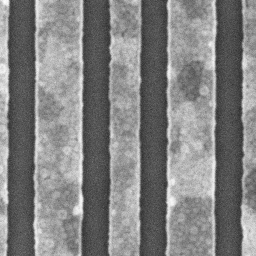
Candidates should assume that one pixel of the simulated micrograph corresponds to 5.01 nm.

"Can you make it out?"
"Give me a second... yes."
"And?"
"lines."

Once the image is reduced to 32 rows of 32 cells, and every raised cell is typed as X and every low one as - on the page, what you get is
X----XXXXX----XXXX---XXXXXX---XX
X----XXXXX----XXXX---XXXXXX---XX
X----XXXXX----XXXX---XXXXXX---XX
X----XXXXX----XXXX---XXXXXX---XX
X---XXXXXX----XXXX---XXXXXX----X
X----XXXXX----XXXX---XXXXXX---XX
X----XXXXX----XXXX---XXXXXX---XX
X----XXXXX----XXX----XXXXXX---XX
X----XXXXX----XXX----XXXXXX---XX
X----XXXXX----XXX----XXXXXX---XX
X----XXXXX----XXXX---XXXXXX---XX
X---XXXXXX----XXX----XXXXXX---XX
X----XXXXX----XXX----XXXXXX---XX
X----XXXXX----XXX----XXXXXX---XX
X----XXXXX----XXX----XXXXXX---XX
X----XXXXX----XXX----XXXXXX---XX
X---XXXXXX----XXX----XXXXXX---XX
X----XXXXX----XXX----XXXXXX---XX
X---XXXXXX----XXX----XXXXXX---XX
X---XXXXXX----XXX----XXXXXX----X
X---XXXXXX----XXX----XXXXXX---XX
X---XXXXXX----XXX----XXXXXX---XX
X---XXXXXX----XXX----XXXXXX---XX
X---XXXXXX----XXX----XXXXXX---XX
X---XXXXXX----XXX----XXXXXX---XX
X---XXXXXX----XXX----XXXXXX---XX
X---XXXXXX----XXX----XXXXXX---XX
X---XXXXXX----XXX----XXXXXX---XX
X---XXXXXX----XXX----XXXXXX---XX
X---XXXXXX----XXX----XXXXXX---XX
X---XXXXXX----XXX----XXXXXX---XX
X---XXXXXX----XXX----XXXXXX---XX